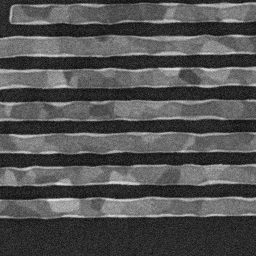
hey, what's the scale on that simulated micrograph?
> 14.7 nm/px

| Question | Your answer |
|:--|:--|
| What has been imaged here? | groups of lines, slits or small figures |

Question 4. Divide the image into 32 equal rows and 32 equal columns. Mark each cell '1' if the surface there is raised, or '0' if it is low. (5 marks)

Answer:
00000000000000000010000000000000
01111111111111111111111111111111
01111111111111111111111111111111
00000000000000000000000000000000
00000000000011100000000001101101
11111111111111111111111111111111
11111111111111111111111111111111
00000000000000000000000000000000
00000000000000000000000010000000
11111111111111111111111111111111
11111111111111111111111111111111
00000000000000000000000000000000
00000000000000000000000000110000
11111111111111111111111111111111
11111111111111111111111111111111
00000000000000000000000000000000
00000000000000000000000000000000
11111111111111111111111111111111
11111111111111111111111111111111
00000000000000000000000000000000
00000000000000000000000000000000
11111111111111111111111111111111
11111111111111111111111111111111
00000000000000000000000000000000
00000000000000000000000000000000
11111111111111111111111111111111
11111111111111111111111111111111
00000000000000000000000000000000
00000000000000000000000000000000
00000000000000000000000000000000
00000000000000000000000000000000
00000000000000000000000000000000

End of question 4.